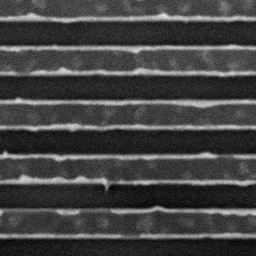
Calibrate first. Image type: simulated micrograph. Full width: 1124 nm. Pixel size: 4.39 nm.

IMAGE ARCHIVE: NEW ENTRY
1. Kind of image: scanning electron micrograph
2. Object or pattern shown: parallel lines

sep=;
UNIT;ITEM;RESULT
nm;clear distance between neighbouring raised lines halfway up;111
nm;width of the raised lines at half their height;127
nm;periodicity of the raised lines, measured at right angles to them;239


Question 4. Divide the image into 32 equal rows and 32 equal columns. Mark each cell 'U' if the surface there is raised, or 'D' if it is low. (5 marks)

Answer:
UUUUUUUUUUUUUUUUUUUUUUUUUUUUUUUU
UUUUUUUUUUUUUUUUUUUUUUUUUUUUUUUU
UUUUUUUUUUUUDUDUUDDDDDDUUUUUUUUU
DDDDDDDDDDDDDDDDDDDDDDDDDDDDDDDD
DDDDDDDDDDDDDDDDDDDDDDDDDDDDDDDD
DDDDDDDDDDDDDDDDDDDDDDDDDDDDDDDD
UUUUUUUUUUUUUUUUUUUUUUUUUUUUUUUU
UUUUUUUUUUUUUUUUUUUUUUUUUUUUUUUU
UUUUUUUUUUUUUUUUUUUUUUUUUUUUUUUU
DDDDDDDDDDDDDDDDDDDDDDDDDDDDDDDD
DDDDDDDDDDDDDDDDDDDDDDDDDDDDDDDD
DDDDDDDDDDDDDDDDDDDDDDDDDDDDDDDD
DDUDDDDDDDDDDDDDDDDDDDDDDDDDDDDD
UUUUUUUUUUUUUUUUUUUUUUUUUUUUUUUU
UUUUUUUUUUUUUUUUUUUUUUUUUUUUUUUU
UUUUUUUUUUUUUUUUUUUUUUUUUUUUUUUU
DDDDDDDDDDDDDDDDDDDDDDDDDDDDDDDD
DDDDDDDDDDDDDDDDDDDDDDDDDDDDDDDD
DDDDDDDDDDDDDDDDDDDDDDDDDDDDDDDD
UUUUUUUUUUUUUUUUUUUUUUUUUUUUUUUU
UUUUUUUUUUUUUUUUUUUUUUUUUUUUUUUU
UUUUUUUUUUUUUUUUUUUUUUUUUUUUUUUU
UUUUUUUUUUUUUUUUUUUUUUUUUUUUUUUU
DDDDDDDDDDDDDDDDDDDDDDDDDDDDDDDD
DDDDDDDDDDDDDDDDDDDDDDDDDDDDDDDD
DDDDDDDDDDDDDDDDDDDDDDDDDDDDDDDD
UUUUUUUUUUUUUUUUUUUUUUUUUUUUUUUU
UUUUUUUUUUUUUUUUUUUUUUUUUUUUUUUU
UUUUUUUUUUUUUUUUUUUUUUUUUUUUUUUU
UUUUUUUUUUUUUUUUUUUUUUUUUUUUUUUU
DDDDDDDDDDDDDDDDDDDDDDDDDDDDDDDD
DDDDDDDDDDDDDDDDDDDDDDDDDDDDDDDD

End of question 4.